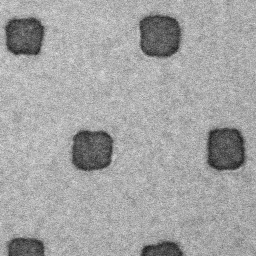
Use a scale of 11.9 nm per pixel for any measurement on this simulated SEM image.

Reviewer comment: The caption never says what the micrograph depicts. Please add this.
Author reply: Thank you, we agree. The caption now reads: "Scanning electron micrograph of holes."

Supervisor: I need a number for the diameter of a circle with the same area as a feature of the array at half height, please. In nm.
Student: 520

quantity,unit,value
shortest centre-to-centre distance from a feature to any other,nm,1560